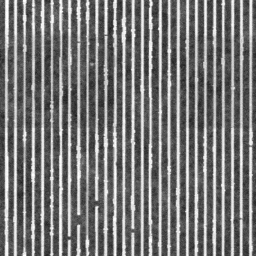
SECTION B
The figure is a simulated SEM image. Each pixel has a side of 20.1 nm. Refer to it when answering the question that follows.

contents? parallel lines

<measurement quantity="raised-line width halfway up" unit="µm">0.0326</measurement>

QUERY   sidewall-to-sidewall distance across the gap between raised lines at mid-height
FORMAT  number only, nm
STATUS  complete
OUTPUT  140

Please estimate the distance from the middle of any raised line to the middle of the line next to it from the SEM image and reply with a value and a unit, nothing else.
182 nm